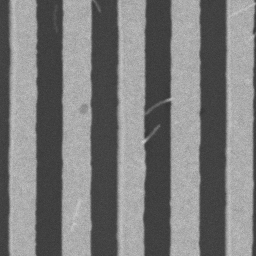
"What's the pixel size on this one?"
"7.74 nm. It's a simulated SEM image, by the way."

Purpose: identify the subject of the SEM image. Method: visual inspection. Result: lines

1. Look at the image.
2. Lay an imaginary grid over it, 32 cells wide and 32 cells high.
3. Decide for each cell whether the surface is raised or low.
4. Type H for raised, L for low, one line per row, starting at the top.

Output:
LHHHHLLLHHHLLLLHHHLLLHHHHLLLHHHH
LHHHLLLLHHHLLLLHHHLLLHHHHLLLHHHH
LHHHHLLLHHHLLLLHHHLLLHHHHLLLHHHH
LHHHHLLLHHHLLLLHHHLLLLHHHLLLHHHH
LHHHHLLLHHHLLLLHHHLLLLHHHLLLHHHH
LHHHHLLLHHHLLLLHHHLLLHHHHLLLHHHH
LHHHHLLLHHHLLLLHHHLLLHHHHLLLHHHH
LHHHLLLLHHHLLLLHHHLLLHHHHLLLHHHH
LHHHHLLLHHHLLLLHHHLLLHHHHLLLHHHH
LHHHHLLLHHHLLLLHHHLLLHHHHLLLHHHH
LHHHHLLLHHHLLLLHHHLLLHHHHLLLHHHH
LHHHHLLLHHHLLLLHHHLLLHHHHLLLHHHH
LHHHHLLLHHHLLLLHHHLLLHHHHLLLHHHH
LHHHLLLLHHHLLLLHHHLLLHHHHLLLHHHH
LHHHLLLLHHHLLLLHHHLLLHHHHLLLHHHH
LHHHLLLLHHHLLLLHHHLLLHHHHLLLHHHH
LHHHLLLLHHHLLLLHHHLLLHHHHLLLHHHH
LHHHLLLLHHHLLLLHHHLLLHHHHLLLHHHH
LHHHLLLLHHHLLLLHHHLLLHHHHLLLHHHH
LHHHLLLLHHHLLLLHHHLLLHHHHLLLHHHH
LHHHHLLLHHHLLLLHHHLLLHHHHLLLHHHH
LHHHLLLLHHHLLLLHHHLLLHHHHLLLHHHH
LHHHLLLLHHHLLLLHHHLLLHHHHLLLHHHH
LHHHLLLLHHHLLLLHHHLLLHHHHLLLHHHH
LHHHLLLLHHHLLLLHHHLLLHHHHLLLHHHH
LHHHLLLLHHHLLLLHHHLLLHHHHLLLHHHH
LHHHLLLLHHHLLLLHHHLLLHHHHLLLHHHH
LHHHLLLLHHHLLLLHHHLLLHHHHLLLHHHH
LHHHLLLLHHHLLLLHHHLLLHHHHLLLHHHH
LHHHLLLLHHHLLLLHHHLLLHHHHLLLHHHH
LHHHLLLLHHHLLLLHHHLLLHHHHLLLHHHH
LHHHLLLLHHHLLLLHHHLLLHHHHLLLHHHL